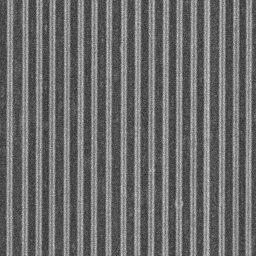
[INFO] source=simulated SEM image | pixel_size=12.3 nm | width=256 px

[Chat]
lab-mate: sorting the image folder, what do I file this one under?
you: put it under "parallel lines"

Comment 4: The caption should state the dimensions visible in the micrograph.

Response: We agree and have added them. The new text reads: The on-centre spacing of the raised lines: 173 nm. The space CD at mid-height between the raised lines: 115 nm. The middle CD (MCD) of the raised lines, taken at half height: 4.63 px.